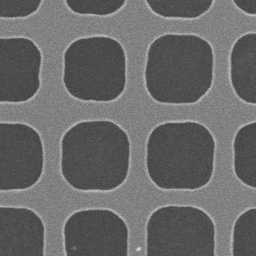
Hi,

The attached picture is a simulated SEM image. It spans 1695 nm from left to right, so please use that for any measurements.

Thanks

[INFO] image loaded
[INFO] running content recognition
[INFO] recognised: holes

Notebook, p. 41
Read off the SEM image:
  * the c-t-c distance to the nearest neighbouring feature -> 560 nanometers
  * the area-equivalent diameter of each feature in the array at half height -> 472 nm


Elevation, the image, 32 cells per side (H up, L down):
LLLLLHHHLLLLLLLHHHHLLLLLLLHHHLLL
LLLLHHHHHLLLLLHHHHHLLLLLLLHHHHHL
HHHHHHHHHHHHHHHHHHHHHHHHHHHHHHHH
HHHHHHHHHHHHHHHHHHHHHHHHHHHHHHHH
HHHHHHHHHHHHHHHHHHHHLLLLLHHHHHLL
LLLLHHHHHLLLLLLHHHHLLLLLLLHHHLLL
LLLLLHHHLLLLLLLHHHHLLLLLLLLHHLLL
LLLLLHHHLLLLLLLLHHLLLLLLLLLHHLLL
LLLLLHHHLLLLLLLLHHLLLLLLLLLHHLLL
LLLLLHHHLLLLLLLLHHLLLLLLLLLHHLLL
LLLLLHHHLLLLLLLLHHLLLLLLLLHHHLLL
LLLLHHHHHLLLLLLHHHHLLLLLLLHHHLLL
LLLHHHHHHHHLLLHHHHHLLLLLLHHHHHLL
HHHHHHHHHHHHHHHHHHHHHHHHHHHHHHHH
HHHHHHHHHHHHHHHHHHHHHHHHHHHHHHHH
LLLHHHHHHHLLLLHHHHHHHLLLLHHHHHHL
LLLLLHHHLLLLLLLLHHHLLLLLLLHHHHLL
LLLLLHHHLLLLLLLLHHHLLLLLLLLHHLLL
LLLLLHHHLLLLLLLLHHLLLLLLLLLHHLLL
LLLLLHHHLLLLLLLLHHLLLLLLLLLHHLLL
LLLLLHHHLLLLLLLLHHLLLLLLLLLHHLLL
LLLLLHHHLLLLLLLLHHHLLLLLLLLHHLLL
LLLLLHHHLLLLLLLLHHHLLLLLLLHHHHLL
LLLHHHHHHLLLLLHHHHHHLLLLLHHHHHHH
HHHHHHHHHHHHHHHHHHHHHHHHHHHHHHHH
HHHHHHHHHHHHHHHHHHHHHHHHHHHHHHHH
LLLLHHHHHHLLLLHHHHHLLLLLLHHHHHHL
LLLLLHHHLLLLLLLHHHHLLLLLLLHHHHLL
LLLLLHHHLLLLLLLLHHLLLLLLLLLHHLLL
LLLLLHHHLLLLLLLLHHLLLLLLLLLHHLLL
LLLLLHHHLLLLLLLLHHLLLLLLLLLHHLLL
LLLLLHHHLLLLLLLLHHLLLLLLLLLHHLLL